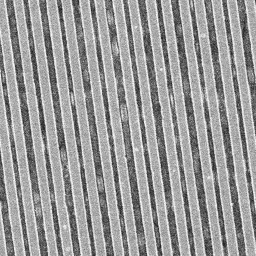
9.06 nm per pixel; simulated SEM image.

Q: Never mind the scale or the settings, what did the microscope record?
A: parallel lines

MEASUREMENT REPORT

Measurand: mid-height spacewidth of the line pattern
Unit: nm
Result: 55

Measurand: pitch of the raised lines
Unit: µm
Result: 0.148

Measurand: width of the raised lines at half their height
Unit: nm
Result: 88.7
